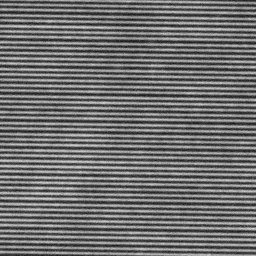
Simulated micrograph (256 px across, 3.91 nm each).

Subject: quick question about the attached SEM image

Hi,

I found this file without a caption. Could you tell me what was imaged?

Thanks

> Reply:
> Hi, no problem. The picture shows parallel lines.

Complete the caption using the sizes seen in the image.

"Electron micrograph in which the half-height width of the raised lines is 6.4 nanometers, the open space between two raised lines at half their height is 13.2 nm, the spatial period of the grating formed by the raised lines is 21.1 nm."